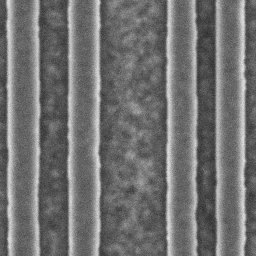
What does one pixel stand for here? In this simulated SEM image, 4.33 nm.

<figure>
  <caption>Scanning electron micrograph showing lines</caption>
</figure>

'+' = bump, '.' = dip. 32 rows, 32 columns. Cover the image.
.++++....+++.........+++...++++.
.++++....+++.........+++...++++.
.++++....+++.........+++...++++.
.++++....+++.........+++...++++.
.++++....+++.........++++..++++.
.++++....+++.........+++...++++.
.++++....+++.........+++...++++.
.++++....+++.........+++...++++.
.++++....+++.........+++...++++.
.++++....+++.........+++...++++.
.++++....+++.........+++...++++.
.++++....+++.........+++...++++.
.++++....+++.........++++..++++.
.++++....+++.........++++..++++.
.++++....+++.........++++..++++.
.++++....+++.........++++..++++.
.++++....+++.........+++...++++.
.++++....+++.........++++..++++.
.++++....+++.........++++..++++.
.++++....+++.........+++...++++.
.++++....+++.........++++..++++.
.++++....+++.........+++...+++..
.++++....+++.........+++...++++.
.++++....+++.........+++...++++.
.++++....+++.........++++..++++.
.++++....+++.........++++..++++.
.++++....+++.........+++...++++.
.++++....+++.........+++...++++.
.++++....+++.........++++..++++.
.++++....+++.........+++...++++.
.++++....+++.........++++..++++.
.++++....+++.........++++..++++.